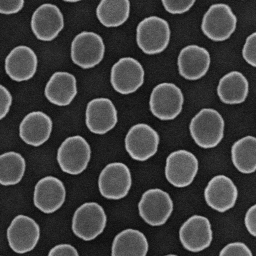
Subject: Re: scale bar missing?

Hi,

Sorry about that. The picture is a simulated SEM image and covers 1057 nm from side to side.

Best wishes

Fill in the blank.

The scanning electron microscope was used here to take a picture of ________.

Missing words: a regular array of raised bodies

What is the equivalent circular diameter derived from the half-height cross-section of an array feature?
142 nm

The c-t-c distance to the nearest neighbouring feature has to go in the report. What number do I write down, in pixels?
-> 47.1